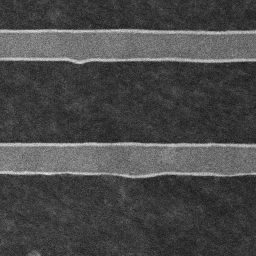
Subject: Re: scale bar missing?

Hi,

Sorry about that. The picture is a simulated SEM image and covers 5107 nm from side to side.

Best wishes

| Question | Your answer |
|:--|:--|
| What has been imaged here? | one or a few lines or trenches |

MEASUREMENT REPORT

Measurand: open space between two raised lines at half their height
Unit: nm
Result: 1690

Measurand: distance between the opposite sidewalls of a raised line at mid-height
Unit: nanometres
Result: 574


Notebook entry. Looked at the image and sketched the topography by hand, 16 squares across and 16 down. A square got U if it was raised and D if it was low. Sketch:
DDDDDDDDDDDDDDDD
DDDDDDDDDDDDDDDD
UUUUUUUUUUUUUUUU
UUUUUUUUUUUUUUUU
DDDDDDDDDDDDDDDD
DDDDDDDDDDDDDDDD
DDDDDDDDDDDDDDDD
DDDDDDDDDDDDDDDD
DDDDDDDDDDDDDDDD
UUUUUUUUUUUUUUUU
UUUUUUUUUUUUUUUU
DDDDDDDDDDDDDDDD
DDDDDDDDDDDDDDDD
DDDDDDDDDDDDDDDD
DDDDDDDDDDDDDDDD
DDDDDDDDDDDDDDDD